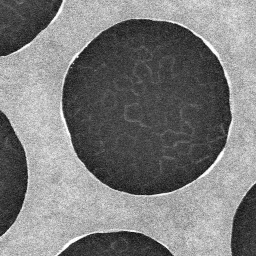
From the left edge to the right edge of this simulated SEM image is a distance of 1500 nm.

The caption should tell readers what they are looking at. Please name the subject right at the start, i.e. holes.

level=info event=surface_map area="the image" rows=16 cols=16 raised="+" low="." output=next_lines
....++++++++++++
...++++....+++++
..++++.......+++
+++++.........++
++++..........++
++++..........++
++++..........++
.+++..........++
.+++..........++
..+++.........++
..+++........+++
..+++++.....++++
..+++++++++++++.
.++++++++++++++.
+++++++.++++++..
++++......++++..